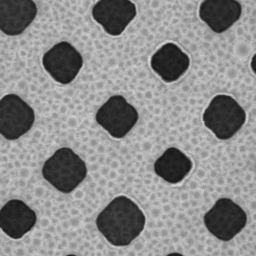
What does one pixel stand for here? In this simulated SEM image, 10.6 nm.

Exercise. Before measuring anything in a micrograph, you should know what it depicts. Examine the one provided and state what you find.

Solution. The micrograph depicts a regular array of holes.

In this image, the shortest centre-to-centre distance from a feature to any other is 801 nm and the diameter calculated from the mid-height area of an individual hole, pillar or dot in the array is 426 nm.